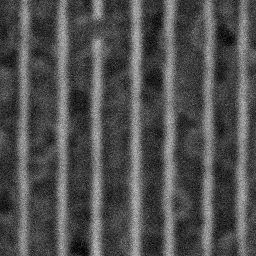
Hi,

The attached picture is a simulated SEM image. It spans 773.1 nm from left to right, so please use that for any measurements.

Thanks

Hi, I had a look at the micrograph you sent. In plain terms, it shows parallel lines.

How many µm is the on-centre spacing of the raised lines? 0.11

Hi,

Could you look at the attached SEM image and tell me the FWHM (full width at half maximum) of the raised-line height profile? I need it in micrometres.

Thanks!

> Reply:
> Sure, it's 0.0181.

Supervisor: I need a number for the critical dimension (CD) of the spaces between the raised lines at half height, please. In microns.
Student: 0.0976